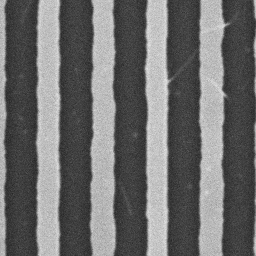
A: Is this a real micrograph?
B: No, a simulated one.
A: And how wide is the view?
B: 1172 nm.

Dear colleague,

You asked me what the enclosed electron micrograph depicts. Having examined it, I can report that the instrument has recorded lines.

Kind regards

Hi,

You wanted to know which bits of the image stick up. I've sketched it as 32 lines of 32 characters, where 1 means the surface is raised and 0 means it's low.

10000110000011000011100001110000
10000110000011000011100001110000
10000110000011000011100001110000
10000110000011000011100001110000
10000110000011000011100001110000
10000110000011000011100001110000
10000110000011000011100001110000
10000110000011000011100001110000
00000110000011000011100001110000
10000110000011000011100001110000
10000110000011000011100001110000
00000110000011000011100001110000
10000110000011000011100001110000
10000110000011000001100001110000
10000110000011000001100001110000
10000110000011000011100001110000
00000110000011000011100001110000
00000110000011000011100001110000
10000110000111000011100001110000
10000110000111000011100001110000
10000110000011000011100001110000
10000110000011000011100001110000
10000110000011000001100001110000
00000110000111000001100001110000
00000110000111000011100001110000
10000110000111000011100001110000
00000110000111000011100001110000
10000110000111000011100001110000
10000110000111000001100001110000
10000110000111000001100001110000
10000110000111000001100001110000
10000110000011000011100001110000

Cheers